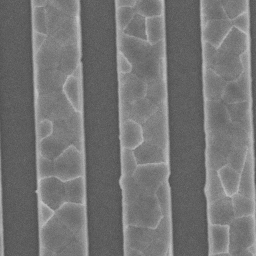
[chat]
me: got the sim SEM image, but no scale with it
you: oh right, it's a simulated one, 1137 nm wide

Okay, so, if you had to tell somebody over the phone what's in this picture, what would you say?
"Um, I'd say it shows one or a few lines or trenches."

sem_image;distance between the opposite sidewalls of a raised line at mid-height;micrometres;0.214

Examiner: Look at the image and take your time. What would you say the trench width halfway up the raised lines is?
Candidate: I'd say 159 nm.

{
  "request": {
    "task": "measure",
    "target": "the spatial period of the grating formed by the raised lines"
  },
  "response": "84.4 pixels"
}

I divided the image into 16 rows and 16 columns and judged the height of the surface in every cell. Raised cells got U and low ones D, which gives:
DDUUUDDUUUDDDUUU
DDUUUDDUUUDDDUUU
DDUUUDDUUUDDDUUU
DDUUUDDUUUDDDUUU
DDUUUDDUUUDDDUUU
DDUUUDDUUUDDDUUU
DDUUUDDUUUDDDUUU
DDUUUDDUUUUDDUUU
DDUUUDDUUUUDDUUU
DDUUUDDDUUUDDUUU
DDUUUDDDUUUDDUUU
DDUUUDDDUUUDDUUU
DDUUUDDDUUUDDUUU
DDUUUDDDUUUDDUUU
DDUUUDDDUUUDDUUU
DDUUUDDDUUUDDUUU